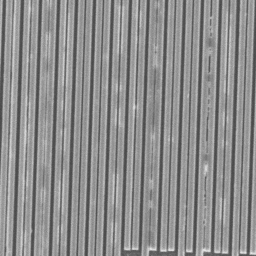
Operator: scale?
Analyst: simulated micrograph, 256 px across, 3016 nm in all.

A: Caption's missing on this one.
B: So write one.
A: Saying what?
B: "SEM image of parallel lines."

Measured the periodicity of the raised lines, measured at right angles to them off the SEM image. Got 106 nanometres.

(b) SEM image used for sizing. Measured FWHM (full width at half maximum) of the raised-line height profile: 0.0692 µm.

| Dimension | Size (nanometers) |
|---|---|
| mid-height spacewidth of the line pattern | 45.6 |